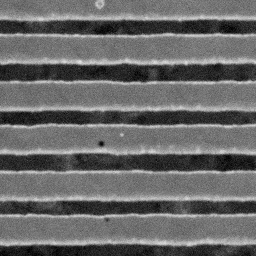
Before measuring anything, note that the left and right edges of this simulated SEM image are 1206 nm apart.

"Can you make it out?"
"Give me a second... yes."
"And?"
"lines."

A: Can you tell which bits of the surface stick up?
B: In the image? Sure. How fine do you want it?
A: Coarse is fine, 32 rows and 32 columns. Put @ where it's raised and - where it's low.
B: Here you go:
@@@@@@@@@@@@@@@@@@@@@@@@@@@@@@@@
@@@@@@@@@@@@@@@@@@@@@@@@@@@@@@@@
--------------------------------
--------------------------------
@@@@@@@@@@@@@@@@@@@@@@@@@@@@@@@@
@@@@@@@@@@@@@@@@@@@@@@@@@@@@@@@@
@@@@@@@@@@@@@@@@@@@@@@@@@@@@@@@@
@@@@@@@@@@@@@@@@@@@@@@@@@@@@@@@@
--------------------------------
--------------------------------
@@@@@@@@@@@@@@@@@@@@@@@@@@@@@@@@
@@@@@@@@@@@@@@@@@@@@@@@@@@@@@@@@
@@@@@@@@@@@@@@@@@@@@@@@@@@@@@@@@
@@@@@@@@@@@@@@@@@@@@@@@@@@@@@-@@
--------------------------------
--------------------------------
@@@@@@@@@@@@@@@@@@@@@@@@@@@@@@@@
@@@@@@@@@@@@@@@@@@@@@@@@@@@@@@@@
@@@@@@@@@@@@@@@@@@@@@@@@@@@@@@@@
--------------------------------
--------------------------------
@@@@@@@-@@@@@@@@@@@--@@-@@@@@@@@
@@@@@@@@@@@@@@@@@@@@@@@@@@@@@@@@
@@@@@@@@@@@@@@@@@@@@@@@@@@@@@@@@
@@@@@@@@@@@@@@@@@@@@@@@@@@@@@@@@
--------------------------------
--------------------------------
@@@@@@@@@@@@@@@@@@@@@@@@@@@@@@@@
@@@@@@@@@@@@@@@@@@@@@@@@@@@@@@@@
@@@@@@@@@@@@@@@@@@@@@@@@@@@@@@@@
--------------------------------
--------------------------------